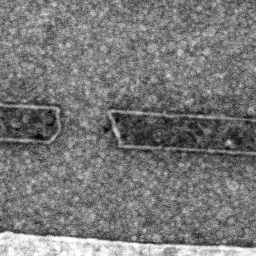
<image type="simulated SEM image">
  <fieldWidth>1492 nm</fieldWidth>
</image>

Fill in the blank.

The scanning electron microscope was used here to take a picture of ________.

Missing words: one or a few lines or trenches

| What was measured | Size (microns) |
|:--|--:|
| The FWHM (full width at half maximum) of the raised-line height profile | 0.196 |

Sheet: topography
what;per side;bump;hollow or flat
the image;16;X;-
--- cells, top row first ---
----------------
----------------
----------------
----------------
----------------
----------------
----------------
XXXX---XXXXXXXXX
XXX----XXXXXXXXX
--------------XX
----------------
----------------
----------------
----------------
----------------
XXXXXXXXXXXXX---